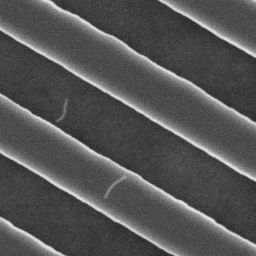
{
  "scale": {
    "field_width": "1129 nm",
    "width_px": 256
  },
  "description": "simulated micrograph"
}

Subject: lines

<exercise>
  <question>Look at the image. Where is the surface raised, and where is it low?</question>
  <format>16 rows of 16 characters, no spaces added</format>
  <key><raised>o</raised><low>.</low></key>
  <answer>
oooo.......ooooo
oooooo......oooo
.oooooo.......oo
...oooooo.......
....ooooooo.....
......oooooo....
o.......oooooo..
ooo......ooooooo
oooo.......ooooo
oooooo.......ooo
..oooooo......oo
...oooooo.......
.....oooooo.....
.......oooooo...
oo......oooooo..
ooo.......oooooo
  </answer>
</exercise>